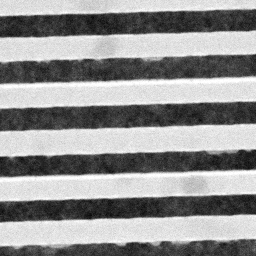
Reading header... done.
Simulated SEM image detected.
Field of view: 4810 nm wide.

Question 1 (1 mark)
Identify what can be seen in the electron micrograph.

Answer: lines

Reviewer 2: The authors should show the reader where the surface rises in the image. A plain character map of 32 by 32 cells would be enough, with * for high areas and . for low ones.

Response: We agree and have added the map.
********************************
*****************...............
................................
................................
.............*******************
********************************
********************************
******..........................
................................
................................
********************************
********************************
********************************
................................
................................
................................
********************************
********************************
********************************
................................
................................
.......................*********
********************************
********************************
*********************...........
................................
................................
...........*********************
********************************
********************************
*******.........................
................................